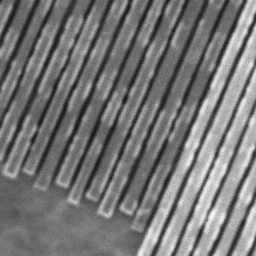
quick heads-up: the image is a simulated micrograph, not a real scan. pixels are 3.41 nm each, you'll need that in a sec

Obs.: parallel lines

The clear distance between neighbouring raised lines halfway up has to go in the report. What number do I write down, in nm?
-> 20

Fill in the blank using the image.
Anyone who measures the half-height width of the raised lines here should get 40.3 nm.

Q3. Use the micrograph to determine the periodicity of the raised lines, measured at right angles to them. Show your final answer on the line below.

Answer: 59.2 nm